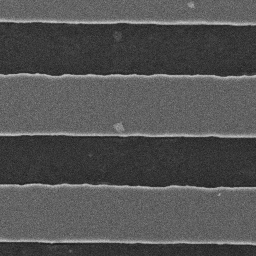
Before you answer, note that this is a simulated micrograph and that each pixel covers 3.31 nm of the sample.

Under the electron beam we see lines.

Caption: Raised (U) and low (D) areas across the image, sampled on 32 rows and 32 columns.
UUUUUUUUUUUUUUUUUUUUUUUUUUUUUUUU
UUUUUUUUUUUUUUUUUUUUUUUUUUUUUUUU
UUUUUUUUUUUUUUUUUUUUUUUUUUUUUUUU
DDDDDDDDDDDDDDDDDDDDDDDDDDDDDDDD
DDDDDDDDDDDDDDDDDDDDDDDDDDDDDDDD
DDDDDDDDDDDDDDDDDDDDDDDDDDDDDDDD
DDDDDDDDDDDDDDDDDDDDDDDDDDDDDDDD
DDDDDDDDDDDDDDDDDDDDDDDDDDDDDDDD
DDDDDDDDDDDDDDDDDDDDDDDDDDDDDDDD
UUUUUUUUUUUUUUUUUUUUUUUUUUUDDDUU
UUUUUUUUUUUUUUUUUUUUUUUUUUUUUUUU
UUUUUUUUUUUUUUUUUUUUUUUUUUUUUUUU
UUUUUUUUUUUUUUUUUUUUUUUUUUUUUUUU
UUUUUUUUUUUUUUUUUUUUUUUUUUUUUUUU
UUUUUUUUUUUUUUUUUUUUUUUUUUUUUUUU
UUUUUUUUUUUUUUUUUUUUUUUUUUUUUUUU
UUUUUUUUUUUUUUUUUUUUUUUUUUUUUUUU
DDDDDDDDDDDDDDDDDDDDDDDDDDDDDDDD
DDDDDDDDDDDDDDDDDDDDDDDDDDDDDDDD
DDDDDDDDDDDDDDDDDDDDDDDDDDDDDDDD
DDDDDDDDDDDDDDDDDDDDDDDDDDDDDDDD
DDDDDDDDDDDDDDDDDDDDDDDDDDDDDDDD
DDDDDDDDDDDDDDDDDDDDDDDDDDDDDDDD
UUUUUUUUUUUUUUUUUUUUUUUUUUDUUUUU
UUUUUUUUUUUUUUUUUUUUUUUUUUUUUUUU
UUUUUUUUUUUUUUUUUUUUUUUUUUUUUUUU
UUUUUUUUUUUUUUUUUUUUUUUUUUUUUUUU
UUUUUUUUUUUUUUUUUUUUUUUUUUUUUUUU
UUUUUUUUUUUUUUUUUUUUUUUUUUUUUUUU
UUUUUUUUUUUUUUUUUUUUUUUUUUUUUUUU
DDDDDDDDDDDDDDDDDDDDDDDDDDDUDUUU
DDDDDDDDDDDDDDDDDDDDDDDDDDDDDDDD